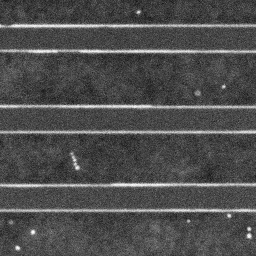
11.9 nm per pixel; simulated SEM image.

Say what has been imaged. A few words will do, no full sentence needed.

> lines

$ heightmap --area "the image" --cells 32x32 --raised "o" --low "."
................................
................................
................................
oooooooooooooooooooooooooooooooo
oooooooooooooooooooooooooooooooo
oooooooooooooooooooooooooooooooo
................................
................................
................................
................................
................................
................................
................................
oooooooooooooooooooooooooooooooo
oooooooooooooooooooooooooooooooo
oooooooooooooooooooooooooooooooo
oooooooooooooooooooooooooooooooo
................................
................................
................................
................................
................................
................................
oooooooooooooooooooooooooooooooo
oooooooooooooooooooooooooooooooo
oooooooooooooooooooooooooooooooo
................................
................................
................................
................................
................................
................................